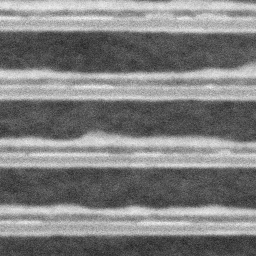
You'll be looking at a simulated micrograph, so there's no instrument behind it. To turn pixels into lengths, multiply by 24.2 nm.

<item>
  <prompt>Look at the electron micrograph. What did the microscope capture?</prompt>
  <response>lines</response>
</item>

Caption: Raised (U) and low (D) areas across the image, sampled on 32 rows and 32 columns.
DDDDDDDDDDDDDDDDDDDDDDDDDDDDDDDD
UUUUUUUUUUUUUUUUUUUUUUUUUUUUUUUU
UUUUUUUUUUUUUUUUUUUUUUUUUUUUUUUU
UUUUUUUUUUUUUUUUUUUUUUUUUUUUUUUU
DDDDDDDDDDDDDDDDDDDDDDDDDDDDDDDD
DDDDDDDDDDDDDDDDDDDDDDDDDDDDDDDD
DDDDDDDDDDDDDDDDDDDDDDDDDDDDDDDD
DDDDDDDDDDDDDDDDDDDDDDDDDDDDDDDD
DDDDDDDDDDDDDDDDDDDDDDDDDDDDDDDD
DDDDDDDDDDDDDDDDDDDDDDDDDDDDDDUU
UUUUUUUUUUUUUUUUUUUUUUUUUUUUUUUU
UUUUUUUUUUUUUUUUUUUUUUUUUUUUUUUU
DDDDDDDDDDDDDDDDDDDDDDDDDDDDDDDD
DDDDDDDDDDDDDDDDDDDDDDDDDDDDDDDD
DDDDDDDDDDDDDDDDDDDDDDDDDDDDDDDD
DDDDDDDDDDDDDDDDDDDDDDDDDDDDDDDD
DDDDDDDDDDDDDDDDDDDDDDDDDDDDDDDD
DDDDDDDDDDDDDDDDDDDDDDDDDDDDDDDD
UUUUUUUUUUUUUUUUUUUUUUUUUUUUUUUU
UUUUUUUUUUUUUUUUUUUUUUUUUUUUUUUU
UUUUUUUUUUUUUUUUUUUUUUUUUUUUUUUU
DDDDDDDDDDDDDDDDDDDDDDDDDDDDDDDD
DDDDDDDDDDDDDDDDDDDDDDDDDDDDDDDD
DDDDDDDDDDDDDDDDDDDDDDDDDDDDDDDD
DDDDDDDDDDDDDDDDDDDDDDDDDDDDDDDD
DDDDDDDDDDDDDDDDDDDDDDDDDDDDDDDD
DDDDDDDDDDDDDDDDDDDDDDDDDDDDDDDD
UUUUUUUUUUUUUUUUUUUUUUUUUUUUUUUU
UUUUUUUUUUUUUUUUUUUUUUUUUUUUUUUU
DDDDDDDDDDDDDDDDDDDDDDDDDDDDDDDD
DDDDDDDDDDDDDDDDDDDDDDDDDDDDDDDD
DDDDDDDDDDDDDDDDDDDDDDDDDDDDDDDD